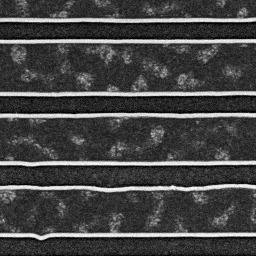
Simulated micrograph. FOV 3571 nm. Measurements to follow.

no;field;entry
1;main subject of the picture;one or a few lines or trenches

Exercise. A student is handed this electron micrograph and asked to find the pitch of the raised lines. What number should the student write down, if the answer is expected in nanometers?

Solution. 1000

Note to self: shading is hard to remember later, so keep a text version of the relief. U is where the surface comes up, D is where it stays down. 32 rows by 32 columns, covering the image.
UUUUUUUUUUUUUUUUUUUUUUUUUUUUUUUU
UUUUUUUUUUUUUUUUUUUUUUUUUUUUUUUU
DDDDDDUUUDDDDUUUUUUUUUUUUDDDDDDD
DDDDDDDDDDDDDDDDDDDDDDDDDDDDDDDD
DDDDDDDDDDDDDDDDDDDDDDDDDDDDDDDD
UUUUUUUUUUUUUUUUUUUUUUUUUUUUUUUU
UUUUUUUUUUUUUUUUUUUUUUUUUUUUUUUU
UUUUUUUUUUUUUUUUUUUUUUUUUUUUUUUU
UUUUUUUUUUUUUUUUUUUUUUUUUUUUUUUU
UUUUUUUUUUUUUUUUUUUUUUUUUUUUUUUU
UUUUUUUUUUUUUUUUUUUUUUUUUUUUUUUU
UUUUUUUUUUUUUUUUUUUUUUUUUUUUUUUU
DDDDDDDDDDDDDDDDDDDDDDDDDDDDDDDD
DDDDDDDDDDDDDDDDDDDDDDDDDDDDDDDD
DDUDDDDDDDDDUUUUUUUUDDDDDDUUUUUD
UUUUUUUUUUUUUUUUUUUUUUUUUUUUUUUU
UUUUUUUUUUUUUUUUUUUUUUUUUUUUUUUU
UUUUUUUUUUUUUUUUUUUUUUUUUUUUUUUU
UUUUUUUUUUUUUUUUUUUUUUUUUUUUUUUU
UUUUUUUUUUUUUUUUUUUUUUUUUUUUUUUU
DDDDDDDDDDDDDDDDDDDDDDDDDDDDDDDD
DDDDDDDDDDDDDDDDDDDDDDDDDDDDDDDD
DDDDDDDDDDDDDDDDDDDDDDDDDDDDDDDD
UUUUDDDDDUDDDDDDDDDDDDDDDDUUUUUU
UUUUUUUUUUUUUUUUUUUUUUUUUUUUUUUU
UUUUUUUUUUUUUUUUUUUUUUUUUUUUUUUU
UUUUUUUUUUUUUUUUUUUUUUUUUUUUUUUU
UUUUUUUUUUUUUUUUUUUUUUUUUUUUUUUU
UUUUUUUUUUUUUUUUUUUUUUUUUUUUUUUU
DDDDUUDDDDDDDDDDDDDDDDDDDDDDDDDD
DDDDDDDDDDDDDDDDDDDDDDDDDDDDDDDD
DDDDDDDDDDDDDDDDDDDDDDDDDDDDDDDD